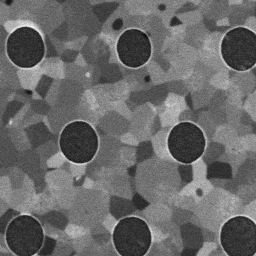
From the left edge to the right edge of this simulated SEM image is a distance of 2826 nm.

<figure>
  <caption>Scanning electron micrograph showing holes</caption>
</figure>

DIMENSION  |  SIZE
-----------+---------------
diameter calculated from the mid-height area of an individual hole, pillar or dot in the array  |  0.443 micrometres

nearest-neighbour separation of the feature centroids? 1190 nm